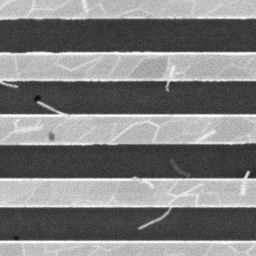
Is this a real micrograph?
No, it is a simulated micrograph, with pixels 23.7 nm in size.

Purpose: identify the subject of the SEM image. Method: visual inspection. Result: lines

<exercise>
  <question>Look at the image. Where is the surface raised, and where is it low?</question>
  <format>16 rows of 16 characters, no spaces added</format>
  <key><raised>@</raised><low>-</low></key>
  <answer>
@@@@@@@@@@@@@@@@
----------------
----------------
@@@@@@@@@@@@@@@@
@@@@@@@@@@@@@@@@
----------------
----------------
@@@@@@@@@@@@@@@@
@@@@@@@@@@@@@@@@
----------------
----------------
@@@@@@@@@@@@@@@@
@@@@@@@@@@@@@@@@
----------------
----------------
@@@@@@@@@@@@@@@@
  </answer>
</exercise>